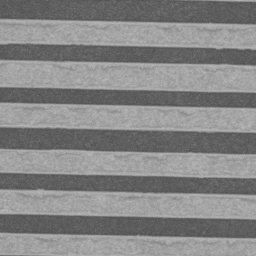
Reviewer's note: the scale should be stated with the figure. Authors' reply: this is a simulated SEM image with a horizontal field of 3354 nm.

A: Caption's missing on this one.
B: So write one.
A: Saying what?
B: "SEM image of parallel lines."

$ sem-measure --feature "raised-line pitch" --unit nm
558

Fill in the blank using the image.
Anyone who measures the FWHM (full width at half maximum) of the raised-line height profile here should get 291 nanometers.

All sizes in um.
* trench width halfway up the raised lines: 0.257